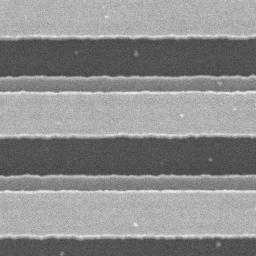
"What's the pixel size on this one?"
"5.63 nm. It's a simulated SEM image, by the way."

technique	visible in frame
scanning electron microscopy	lines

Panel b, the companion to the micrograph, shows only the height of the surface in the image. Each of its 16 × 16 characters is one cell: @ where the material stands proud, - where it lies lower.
@@@@@@@@@@@@@@@@
@@@@@@@@@@@@@@@@
----------------
----------------
----------------
@@@@@@@@@@@@@@@@
@@@@@@@@@@@@@@@@
@@@@@@@@@@@@@@@@
@@@@@@@-@-@@----
----------------
----------------
@@@@@@@@@@@@@@@@
@@@@@@@@@@@@@@@@
@@@@@@@@@@@@@@@@
@@@@@@@@@@@@@@@@
----------------